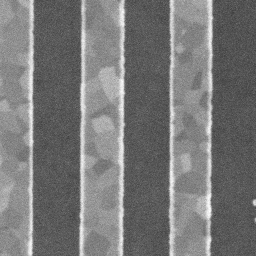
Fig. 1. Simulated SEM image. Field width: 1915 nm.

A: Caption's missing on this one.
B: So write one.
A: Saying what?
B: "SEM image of lines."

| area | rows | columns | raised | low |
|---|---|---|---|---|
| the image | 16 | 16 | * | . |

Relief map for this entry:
**...***...**...
**...***...**...
**...***...**...
**...***...**...
**...***...**...
**...***...**...
**...***...**...
**...***...**...
**...***...**...
**...***...**...
**...***...**...
**...***...**...
**...***...**...
**...***...**...
**...***...**...
**...***...**...